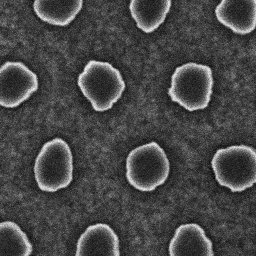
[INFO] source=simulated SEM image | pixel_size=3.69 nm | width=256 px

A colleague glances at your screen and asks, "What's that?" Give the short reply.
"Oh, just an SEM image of raised bodies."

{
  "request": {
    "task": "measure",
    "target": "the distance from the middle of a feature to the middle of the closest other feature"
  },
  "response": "0.336 micrometres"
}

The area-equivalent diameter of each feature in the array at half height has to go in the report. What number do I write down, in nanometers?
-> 164